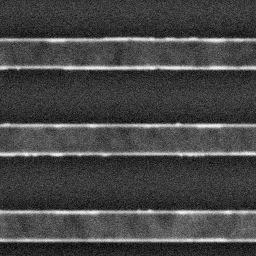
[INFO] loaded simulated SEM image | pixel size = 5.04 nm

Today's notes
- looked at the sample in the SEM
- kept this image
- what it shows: lines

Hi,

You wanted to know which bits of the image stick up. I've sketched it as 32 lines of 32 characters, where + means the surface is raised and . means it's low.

................................
................................
................................
................................
................................
++++++++++++++++++++++++++++++++
++++++++++++++++++++++++++++++++
++++++++++++++++++++++++++++++++
........+.++++++....++++++++++++
................................
................................
................................
................................
................................
................................
................................
++++++++++++++++++++++++++++++++
++++++++++++++++++++++++++++++++
++++++++++++++++++++++++++++++++
................................
................................
................................
................................
................................
................................
................................
++++++++++++++++++++++++++++++++
++++++++++++++++++++++++++++++++
++++++++++++++++++++++++++++++++
++++++++++++++++++++++++++++++++
................................
................................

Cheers